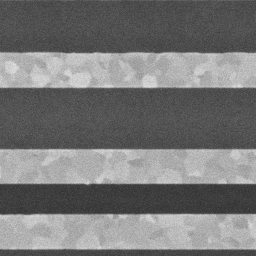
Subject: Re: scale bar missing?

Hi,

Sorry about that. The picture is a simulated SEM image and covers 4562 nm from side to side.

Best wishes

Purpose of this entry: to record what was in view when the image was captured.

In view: lines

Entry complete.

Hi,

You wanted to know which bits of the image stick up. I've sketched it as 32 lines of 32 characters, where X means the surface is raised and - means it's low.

--------------------------------
--------------------------------
--------------------------------
--------------------------------
--------------------------------
--------------------------------
--------------------------------
XXXXXXXXXXXXXXXXXXXXXXXXXXXXXXXX
XXXXXXXXXXXXXXXXXXXXXXXXXXXXXXXX
XXXXXXXXXXXXXXXXXXXXXXXXXXXXXXXX
XXXXXXXXXXXXXXXXXXXXXXXXXXXXXXXX
--------------------------------
--------------------------------
--------------------------------
--------------------------------
--------------------------------
--------------------------------
--------------------------------
--------------------------------
XXXXXXXXXXXXXXXXXXXXXXXXXXXXXXXX
XXXXXXXXXXXXXXXXXXXXXXXXXXXXXXXX
XXXXXXXXXXXXXXXXXXXXXXXXXXXXXXXX
XXXXXXXXXXXXXXXXXXXXXXXXXXXXXXXX
--------------------------------
--------------------------------
--------------------------------
--------------------------------
XXXXXXXXXXXXXXXXXXXXXXXXXXXXXXXX
XXXXXXXXXXXXXXXXXXXXXXXXXXXXXXXX
XXXXXXXXXXXXXXXXXXXXXXXXXXXXXXXX
XXXXXXXXXXXXXXXXXXXXXXXXXXXXXXXX
--------------------------------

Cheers